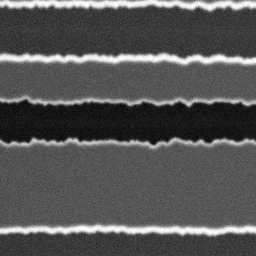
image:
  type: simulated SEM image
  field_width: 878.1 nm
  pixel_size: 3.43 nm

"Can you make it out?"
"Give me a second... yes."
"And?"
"lines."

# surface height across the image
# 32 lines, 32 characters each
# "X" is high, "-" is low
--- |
-XXX-X-XX-XXX-X-X-----XXXXXX-XXX
--------------------------------
--------------------------------
--------------------------------
--------------------------------
--------------------------------
--------------------------------
XXXXXXXXXXXXXXXXXXXXXX-XXXXXXX--
XXXXXXXXXXXXXXXXXXXXXXXXXXXXXXXX
XXXXXXXXXXXXXXXXXXXXXXXXXXXXXXXX
XXXXXXXXXXXXXXXXXXXXXXXXXXXXXXXX
XXXXXXXXXXXXXXXXXXXXXXXXXXXXXXXX
XXXXXXXXXXXXXXXXXXXXXXXXXXXXXXXX
--------------------------------
--------------------------------
--------------------------------
--------------------------------
--------X-----------------------
XXXXXXXXXXXXXXXXXXXXXXXXXXXXXXXX
XXXXXXXXXXXXXXXXXXXXXXXXXXXXXXXX
XXXXXXXXXXXXXXXXXXXXXXXXXXXXXXXX
XXXXXXXXXXXXXXXXXXXXXXXXXXXXXXXX
XXXXXXXXXXXXXXXXXXXXXXXXXXXXXXXX
XXXXXXXXXXXXXXXXXXXXXXXXXXXXXXXX
XXXXXXXXXXXXXXXXXXXXXXXXXXXXXXXX
XXXXXXXXXXXXXXXXXXXXXXXXXXXXXXXX
XXXXXXXXXXXXXXXXXXXXXXXXXXXXXXXX
XXXXXXXXXXXXXXXXXXXXXXXXXXXXXXXX
XXXXXXXXXXXXXXXXXXXXXXXXXXXXXXXX
--------------------------------
--------------------------------
--------------------------------